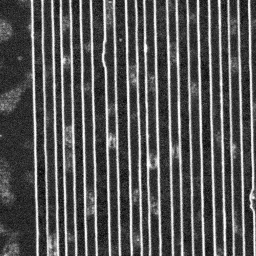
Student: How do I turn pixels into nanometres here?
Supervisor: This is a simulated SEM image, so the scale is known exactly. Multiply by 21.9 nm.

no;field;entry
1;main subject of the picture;parallel lines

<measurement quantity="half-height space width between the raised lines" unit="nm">228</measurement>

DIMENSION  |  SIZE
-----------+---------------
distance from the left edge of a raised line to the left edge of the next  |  453 nm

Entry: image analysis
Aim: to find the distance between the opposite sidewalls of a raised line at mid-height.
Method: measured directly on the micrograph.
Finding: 228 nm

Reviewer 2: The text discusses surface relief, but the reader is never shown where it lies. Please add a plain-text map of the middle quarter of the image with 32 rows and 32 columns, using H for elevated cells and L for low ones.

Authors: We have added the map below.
HHLLLHHLLLHHHLLLHHLLLHHLLLHHLLLH
HHLLLHHLLLHHHLLLHHLLLHHLLLHHLLLH
HHLLLHHLLLHHHLLLHHLLLHHLLLHHLLLH
HHLLLHHLLLHHHLLLHHLLLHHLLLHHLLLH
HHLLLHHLLLHHHLLLHHLLLHHLLLHHLLLH
HHLLLHHLLLHHHLLLHHLLHHHLLLHHHLLH
HHLLLHHLLLLHHLLLHHLLHHHLLLHHHLLH
HHLLLHHLLLLHHLLLHHLLLHHLLLHHHLLH
HHLLLHHLLLLHHLLLHHLLLHHLLLHHHLLH
HHLLLHHLLLLHHLLLHHLLLHHLLLHHHLLH
HHLLLHHLLLLHHLLLHHLLLHHLLLHHHLLH
HHLLLHHLLLLHHLLLHHLLLHHLLLLHHLLH
HHLLLHHLLLLHHLLLHHLLLHHLLLLHHLLL
HHLLLHHLLLLHHLLLHHHLLHHLLLLHHLLL
HHLLLHHLLLLHHLLLHHHLLHHLLLLHHLLL
HHLLLHHLLLLHHLLLHHHLLHHLLLLHHLLL
HHLLLHHLLLLHHLLLHHHLLHHLLLLHHLLL
HHLLLHHLLLLHHLLLHHHLLHHLLLLHHLLL
HHLLLHHLLLLHHLLLHHHLLHHLLLLHHLLL
HHLLLHHHLLLHHLLLHHHLLHHLLLLHHLLL
HHLLLHHHLLLHHLLLHHHLLHHLLLLHHLLL
HHLLLHHHLLLHHLLLHHHLLHHLLLLHHLLL
HHLLLHHHLLLHHLLLHHHLLHHLLLLHHLLL
HHLLLHHHLLLHHLLLHHHLLHHLLLLHHLLL
HHLLLHHHLLLHHLLLHHHLLHLHLLLHHLLL
HHLLLHHHLLLHHLLLHHHLLHHHLLLHHLLL
HHLLLHHHLLLHHLLLHHHLLHHHLLLHHLLL
HHLLLHHHLLLHHLLLLHHLLHHHLLLHHLLL
HHLLLHHHLLLHHLLLLHHLLHHHLLLHHLLL
HHHLLHHHLLLHHLLLLHHLLHHHLLLHHLLL
HHHLLHHHLLLHHLLLLHHLLHHHLLLHHLLL
HHHLLHHHLLLHHLLLLHHLLHHHLLLHHLLL